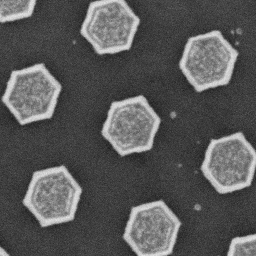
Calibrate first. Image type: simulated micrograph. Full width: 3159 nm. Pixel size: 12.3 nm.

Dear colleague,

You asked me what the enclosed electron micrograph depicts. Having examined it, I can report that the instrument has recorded raised bodies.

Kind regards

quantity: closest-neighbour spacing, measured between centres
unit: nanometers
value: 1260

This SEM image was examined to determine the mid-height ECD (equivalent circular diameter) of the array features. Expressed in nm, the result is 634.